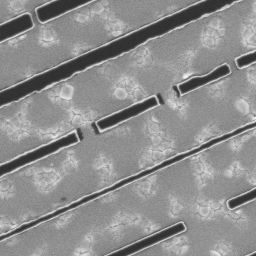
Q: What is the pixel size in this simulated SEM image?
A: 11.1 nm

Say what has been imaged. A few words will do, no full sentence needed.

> one or a few lines or trenches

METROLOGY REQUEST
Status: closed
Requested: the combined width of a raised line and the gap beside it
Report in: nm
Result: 696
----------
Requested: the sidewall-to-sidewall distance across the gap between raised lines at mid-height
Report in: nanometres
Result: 585